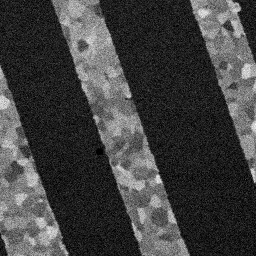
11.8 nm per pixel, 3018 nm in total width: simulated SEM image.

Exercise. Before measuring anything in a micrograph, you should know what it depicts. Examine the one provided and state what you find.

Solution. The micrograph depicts one or a few lines or trenches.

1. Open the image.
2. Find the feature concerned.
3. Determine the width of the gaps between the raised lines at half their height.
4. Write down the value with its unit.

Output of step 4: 856 nm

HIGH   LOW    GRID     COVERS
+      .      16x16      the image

...+++......+++.
....+++.....+++.
....+++......++.
.....++......+++
.....+++......++
+....+++......++
+.....++......++
+.....+++......+
++....+++......+
++.....++......+
++.....+++......
+++....+++......
+++.....+++.....
+++.....+++.....
++++....+++.....
++++.....+++....